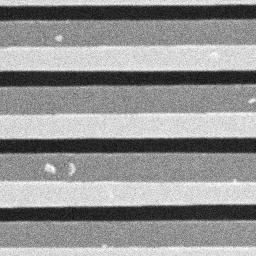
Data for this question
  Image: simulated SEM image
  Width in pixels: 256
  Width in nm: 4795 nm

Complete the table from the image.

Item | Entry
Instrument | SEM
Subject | lines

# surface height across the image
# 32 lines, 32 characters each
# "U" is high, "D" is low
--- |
UUUUUUUUUUUUUUUUUUUUUUUUUUUUDDDD
DDDDDDDDDDDDDDDDDDDDDDDDDDDDDDDD
DDDDDDDDDDDDDDDDDDDDDDDDDDDDDDDD
UUUUUUUUUUUUUUUUUUUUUUUUUUUUUUUU
UUUUUUUUUUUUUUUUUUUUUUUUUUUUUUUU
UUUUUUUUUUUUUUUUUUUUUUUUUUUUUUUU
UUUUUUUUUUUUUUUUUUUUUUUUUUUUUUUU
UUUUUUUUUUUUUUUUUUUUUUUUUUUUUUUU
UUUUUUUUUUUUUUUUUUUUUUUUUUUUUUUU
DDDDDDDDDDDDDDDDDDDDDDDDDDDDDDDD
DDDDDDDDDDDDDDDDDDDDDDDDDDDDDDDD
UUUUUUUUUUUUUUUUUUUUUUUUUUUUUUUU
UUUUUUUUUUUUUUUUUUUUUUUUUUUUUUUU
UUUUUUUUUUUUUUUUUUUUUUUUUUUUUUUU
UUUUUUUUUUUUUUUUUUUUUUUUUUUUUUUU
UUUUUUUUUUUUUUUUUUUUUUUUUUUUUUUU
UUUUUUUUUUUUUUUUUUUUUUUUUUUUUUUU
DDDDDDDDDDDDDDDDDDDDDDDDDDDDDDDD
DDDDDDDDDDDDDDDDDDDDDDDDDDDDDDDD
UUUUUUUUUUUUUUUUUUUUUUUUUUUUUUUU
UUUUUUUUUUUUUUUUUUUUUUUUUUUUUUUU
UUUUUUUUUUUUUUUUUUUUUUUUUUUUUUUU
UUUUUUUUUUUUUUUUUUUUUUUUUUUUUUUU
UUUUUUUUUUUUUUUUUUUUUUUUUUUUUUUU
UUUUUUUUUUUUUUUUUUUUUUUUUUUUUUUU
UUUUUUUUUUUUUUUUUUUUUUUUUDDDDDDD
DDDDDDDDDDDDDDDDDDDDDDDDDDDDDDDD
DDDDDDDDDDDDDDDDDDDDDDDDDDDDDDDD
UUUUUUUUUUUUUUUUUUUUUUUUUUUUUUUU
UUUUUUUUUUUUUUUUUUUUUUUUUUUUUUUU
UUUUUUUUUUUUUUUUUUUUUUUUUUUUUUUU
UUUUUUUUUUUUUUUUUUUUUUUUUUUUUUUU